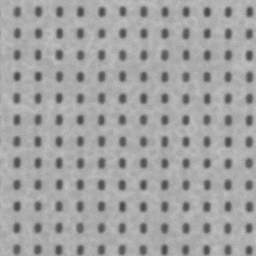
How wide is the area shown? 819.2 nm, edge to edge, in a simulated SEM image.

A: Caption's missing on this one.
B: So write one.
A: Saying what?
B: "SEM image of a regular array of holes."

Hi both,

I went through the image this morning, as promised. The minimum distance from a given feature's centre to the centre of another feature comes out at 67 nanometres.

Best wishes